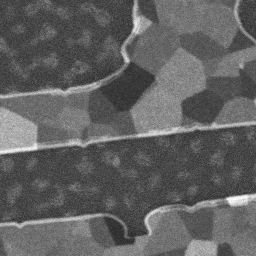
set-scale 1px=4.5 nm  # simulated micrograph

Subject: one or a few lines or trenches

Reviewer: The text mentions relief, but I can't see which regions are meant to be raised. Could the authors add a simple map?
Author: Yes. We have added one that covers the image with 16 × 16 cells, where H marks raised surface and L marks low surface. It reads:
LLLLLLLLHHHHHHHL
LLLLLLLLHHHHHHHL
LLLLLLLLHHHHHHHH
LLLLLLLLHHHHHHHH
LLLLLLLHHHHHHHHH
LLLLLHHHHHHHHHHH
HHHHHHHHHHHHHHHH
HHHHHHHHHHHHHHHH
HHHHHHHHLLLLLLLL
LLLLLLLLLLLLLLLL
LLLLLLLLLLLLLLLL
LLLLLLLLLLLLLLLL
LLLLLLLLLLLLLLHH
LLLLLLHLLHHHHHHH
HHHHHHHHLHHHHHHH
HHHHHHHHHHHHHHHH